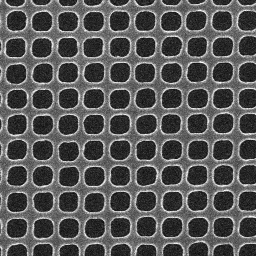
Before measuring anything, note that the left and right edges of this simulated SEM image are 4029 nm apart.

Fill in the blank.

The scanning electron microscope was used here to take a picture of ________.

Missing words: a regular array of holes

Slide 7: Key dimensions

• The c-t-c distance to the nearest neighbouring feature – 399 nm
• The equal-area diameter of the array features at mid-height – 21 px